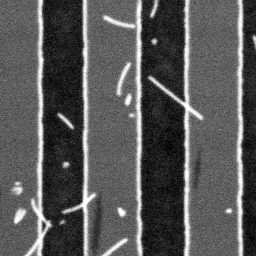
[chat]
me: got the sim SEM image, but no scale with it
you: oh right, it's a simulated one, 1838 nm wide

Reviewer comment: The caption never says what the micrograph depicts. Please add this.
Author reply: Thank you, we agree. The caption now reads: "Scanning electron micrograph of lines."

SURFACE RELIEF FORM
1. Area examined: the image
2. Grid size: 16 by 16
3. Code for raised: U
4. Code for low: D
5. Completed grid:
UUUDDUUUUDDDUUUD
UUUDDUUUUDDDUUUD
UUUDDUUUUDDDUUUD
UUUDDUUUUDDDUUUD
UUUDDUUUUDDDUUUD
UUUDDUUUUDDDUUUD
UUUDDUUUUDDDUUUD
UUUDDUUUUDDDUUUD
UUUDDUUUUDDDUUUD
UUUDDUUUUDDDUUUD
UUUDDUUUUDDDUUUD
UUUDDUUUUDDDUUUD
UUUDDUUUUDDDUUUD
UUUDDUUUUDDDUUUD
UUUDDUUUUDDDUUUD
UUUDDUUUUDDDUUUD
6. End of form